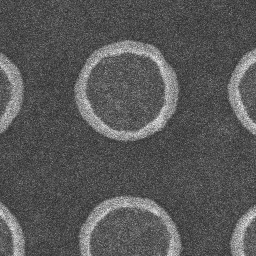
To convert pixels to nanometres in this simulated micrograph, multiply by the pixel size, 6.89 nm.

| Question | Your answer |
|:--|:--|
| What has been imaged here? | raised bodies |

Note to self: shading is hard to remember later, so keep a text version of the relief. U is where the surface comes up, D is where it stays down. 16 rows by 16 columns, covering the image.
DDDDDDDDDDDDDDDD
DDDDDDDDDDDDDDDD
DDDDDDDDDDDDDDDD
DDDDDDUUUUDDDDDD
UDDDDUUUUUDDDDDU
UDDDDUUUUUUDDDDU
UDDDDUUUUUUDDDDU
DDDDDDUUUUDDDDDU
DDDDDDDUUDDDDDDD
DDDDDDDDDDDDDDDD
DDDDDDDDDDDDDDDD
DDDDDDDDDDDDDDDD
DDDDDDDDDDDDDDDD
UDDDDDUUUUDDDDDD
UDDDDUUUUUUDDDDU
UDDDDUUUUUUDDDDU